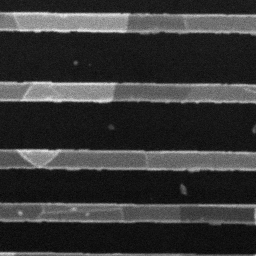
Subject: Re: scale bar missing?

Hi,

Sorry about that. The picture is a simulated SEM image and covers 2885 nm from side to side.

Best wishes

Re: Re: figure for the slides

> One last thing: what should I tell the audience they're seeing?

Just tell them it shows lines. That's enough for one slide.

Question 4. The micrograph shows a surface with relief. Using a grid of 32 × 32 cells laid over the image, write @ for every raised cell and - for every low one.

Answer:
--------------------------------
--------------------------------
@@@@@@@@@@@@@@@@@@@@@@@@@@@@@@@@
@@@@@@@@@@@@@@@@@@@@@@@@@@@@@@@@
--------------------------------
--------------------------------
--------------------------------
--------------------------------
--------------------------------
--------------------------------
@@@@@@@@@-----------------------
@@@@@@@@@@@@@@@@@@@@@@@@@@@@@@@@
-@@@@@--@@@@@@@@-@@@@@@@@@@@@@@@
--------------------------------
--------------------------------
--------------------------------
--------------------------------
--------------------------------
--------------------------------
@@@@@@@@@@@@@@@@@@@@@@@@@@@@@@@@
@@@@@@@@@@@@@@@@@@@@@@@@@@@@@@@@
--------------------------------
--------------------------------
--------------------------------
--------------------------------
--------------------------------
@@@@@@@@@@@@@@@@@@@@@@@@@@@@@@@@
@@@@@@@@@@@@@@@@@@@@@@@@@@@@@@@@
--------------------------------
--------------------------------
--------------------------------
--------------------------------